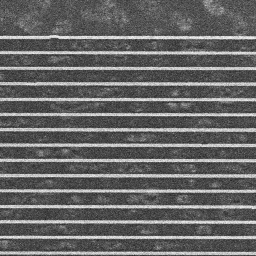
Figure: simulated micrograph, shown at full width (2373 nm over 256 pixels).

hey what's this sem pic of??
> parallel lines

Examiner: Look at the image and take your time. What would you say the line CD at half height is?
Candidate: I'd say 2.5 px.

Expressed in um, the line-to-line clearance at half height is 0.118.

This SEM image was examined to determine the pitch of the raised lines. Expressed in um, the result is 0.143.